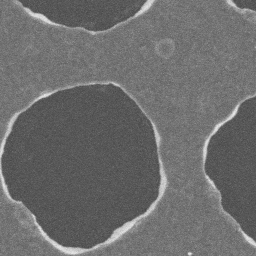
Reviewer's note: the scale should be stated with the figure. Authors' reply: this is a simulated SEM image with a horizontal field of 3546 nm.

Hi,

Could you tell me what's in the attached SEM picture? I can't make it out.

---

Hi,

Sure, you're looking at holes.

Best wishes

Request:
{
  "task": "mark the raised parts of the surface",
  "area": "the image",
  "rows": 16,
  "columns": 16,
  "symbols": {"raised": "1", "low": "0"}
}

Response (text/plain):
1100000001111110
1111000111111111
1111111111111111
1111111111111111
1111111111111111
1111000111111111
1100000001111110
1000000001111100
0000000000111000
0000000000111000
0000000000111000
0000000000111000
1000000000111100
1100000001111100
1110000111111110
1111001111111111